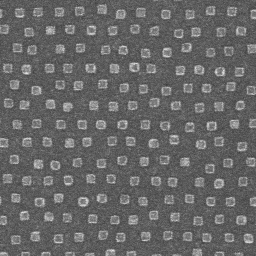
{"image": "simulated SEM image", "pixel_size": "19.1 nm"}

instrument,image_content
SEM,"a regular array of raised bodies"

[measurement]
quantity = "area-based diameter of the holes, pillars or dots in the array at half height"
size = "170 nm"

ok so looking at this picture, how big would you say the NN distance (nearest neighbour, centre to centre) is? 355 nm